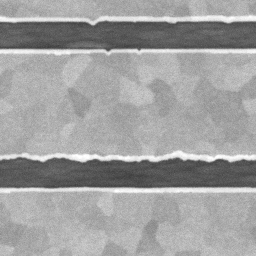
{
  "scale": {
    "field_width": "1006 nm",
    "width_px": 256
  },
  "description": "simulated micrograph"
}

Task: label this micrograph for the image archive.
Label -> one or a few lines or trenches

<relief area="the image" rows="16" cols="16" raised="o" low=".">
oooooooooooooooo
................
................
oooooooooooooooo
oooooooooooooooo
oooooooooooooooo
oooooooooooooooo
oooooooooooooooo
oooooooooooooooo
oooooooooooooooo
................
................
oooooooooooooooo
oooooooooooooooo
oooooooooooooooo
oooooooooooooooo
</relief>